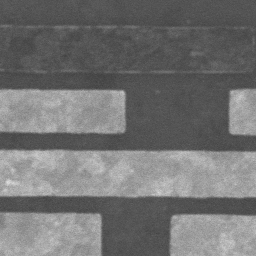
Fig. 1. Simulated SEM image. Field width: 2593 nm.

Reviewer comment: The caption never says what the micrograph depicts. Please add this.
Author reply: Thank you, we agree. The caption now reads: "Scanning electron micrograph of wiring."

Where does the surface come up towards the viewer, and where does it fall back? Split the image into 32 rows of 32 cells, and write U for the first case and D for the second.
DDDDDDDDDDDDDDDDDDDDDDDDDDDDDDDD
DDDDDDDDDDDDDDDDDDDDDDDDDDDDDDDD
DDDDDDDDDDDDDDDDDDDDDDDDDDDDDDDD
UUUUUUUUUUUUUUUUUUUUDDDDDDUUUDDD
UUUUUUUUUUUUUUUUUUUUUUUUUUUUUUUU
UUUUUUUUUUUUUUUUUUUUUUUUUUUUUUUU
UUUUUUUUUUUUUUUUUUUUUUUUUUUUUUUU
UUUUUUUUUUUUUUUUUUUUUUUUUUUUUUUU
UUUUUUUUUUUUUUUUUUUUUUUUUUUUUUUU
DDDDDDDDDDDDDDDDDDDDDDDDDDDDDDDD
DDDDDDDDDDDDDDDDDDDDDDDDDDDDDDDD
UUUUUUUUUUUUUUUDDDDDDDDDDDDDDUUU
UUUUUUUUUUUUUUUUDDDDDDDDDDDDDUUU
UUUUUUUUUUUUUUUDDDDDDDDDDDDDDUUU
UUUUUUUUUUUUUUUUDDDDDDDDDDDDDUUU
UUUUUUUUUUUUUUUUDDDDDDDDDDDDDUUU
DDDDUUDDUUUDUUUDDDDDDDDDDDDDDUUU
DDDDDDDDDDDDDDDDDDDDDDDDDDDDDDDD
DDDDDDDDDDDDDDDDDDDDDDDDDDDDDDDD
UUUUUUUUUUUUUUUUUUUUUUUUUUUUUUUU
UUUUUUUUUUUUUUUUUUUUUUUUUUUUUUUU
UUUUUUUUUUUUUUUUUUUUUUUUUUUUUUUU
UUUUUUUUUUUUUUUUUUUUUUUUUUUUUUUU
UUUUUUUUUUUUUUUUUUUUUUUUUUUUUUUU
DDDDDDDDDDDDDDUUUUDDDUUUUUUUUUUU
DDDDDDDDDDDDDDDDDDDDDDDDDDDDDDDD
DDDDDDDDDDDDDDDDDDDDDDDDDDDDDDDD
UUUUUUUUUUUUDDDDDDDDDUUUUUUUUUUU
UUUUUUUUUUUUDDDDDDDDDUUUUUUUUUUU
UUUUUUUUUUUUDDDDDDDDDUUUUUUUUUUU
UUUUUUUUUUUUDDDDDDDDDUUUUUUUUUUU
UUUUUUUUUUUUDDDDDDDDDUUUUUUUUUUU